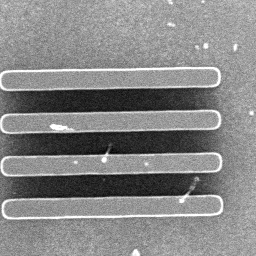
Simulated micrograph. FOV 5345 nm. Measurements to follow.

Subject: groups of lines, slits or small figures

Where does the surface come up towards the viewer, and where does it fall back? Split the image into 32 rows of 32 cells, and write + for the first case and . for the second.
................................
................................
................................
................................
................................
................................
................................
................................
................................
+++++++++++++++++++++++++++.....
+++++++++++++++++++++++++++.....
................................
................................
................................
.++++++++++++++++++++++++++.....
+++++++++++++++++++++++++++.....
.+++++++++......................
................................
................................
.......++++++++++++++++++++.....
++++++++++++++++++++++++++++....
++++++++++++++++++++++++........
................................
................................
.......................+........
.+++++++++++++++++++++++++++....
+++++++++++++++++++++++++++.....
................................
................................
................................
................................
................................